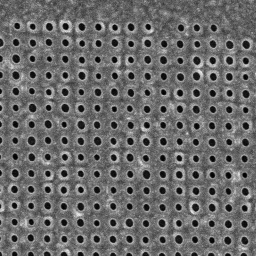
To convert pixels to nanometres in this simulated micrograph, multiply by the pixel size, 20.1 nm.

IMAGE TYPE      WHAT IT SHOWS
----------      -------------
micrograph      a regular array of holes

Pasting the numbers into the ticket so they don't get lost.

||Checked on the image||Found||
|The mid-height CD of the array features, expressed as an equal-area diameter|142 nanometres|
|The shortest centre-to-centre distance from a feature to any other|322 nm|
